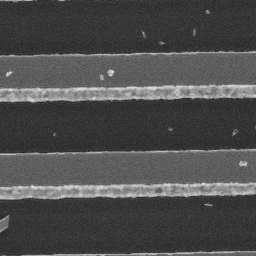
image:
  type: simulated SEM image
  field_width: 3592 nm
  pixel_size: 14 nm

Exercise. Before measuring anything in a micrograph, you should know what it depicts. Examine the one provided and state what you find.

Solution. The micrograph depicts lines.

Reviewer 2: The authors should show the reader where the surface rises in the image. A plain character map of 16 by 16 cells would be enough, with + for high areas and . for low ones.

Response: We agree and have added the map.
................
................
................
..++++++++++++++
++++++++++++++++
++++++++++++++++
................
................
................
..........++++++
++++++++++++++++
++++++++++++++++
................
................
................
................